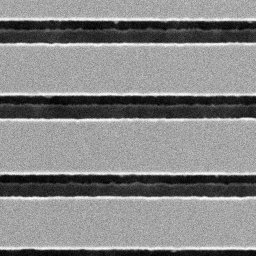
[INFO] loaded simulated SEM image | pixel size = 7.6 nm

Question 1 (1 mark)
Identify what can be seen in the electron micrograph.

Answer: lines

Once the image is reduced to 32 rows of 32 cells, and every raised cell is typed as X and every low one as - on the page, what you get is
XXXXXXXXXXXXXXXXXXXXXXXXXXXXXXXX
XXXXXXXXXXXXXXXXXXXXXXXXXXXXXXXX
XXXXXXXXXXXXXXXXXXXXXXXXXXXXXXXX
--------------------------------
--------------------------------
XXXXXXXXXXXXXXXXXXXXXXXXXXXXXXXX
XXXXXXXXXXXXXXXXXXXXXXXXXXXXXXXX
XXXXXXXXXXXXXXXXXXXXXXXXXXXXXXXX
XXXXXXXXXXXXXXXXXXXXXXXXXXXXXXXX
XXXXXXXXXXXXXXXXXXXXXXXXXXXXXXXX
XXXXXXXXXXXXXXXXXXXXXXXXXXXXXXXX
XXXXXXXXXXXXXXXXXXXXXXXXXXXXXXXX
--------------------------------
--------------------------------
--------------------------------
XXXXXXXXXXXXXXXXXXXXXXXXXXXXXXXX
XXXXXXXXXXXXXXXXXXXXXXXXXXXXXXXX
XXXXXXXXXXXXXXXXXXXXXXXXXXXXXXXX
XXXXXXXXXXXXXXXXXXXXXXXXXXXXXXXX
XXXXXXXXXXXXXXXXXXXXXXXXXXXXXXXX
XXXXXXXXXXXXXXXXXXXXXXXXXXXXXXXX
XXXXXXXXXXXXXXXXXXXXXXXXXXXXXXXX
--------------------------------
--------------------------------
--------------------------------
XXXXXXXXXXXXXXXXXXXXXXXXXXXXXXXX
XXXXXXXXXXXXXXXXXXXXXXXXXXXXXXXX
XXXXXXXXXXXXXXXXXXXXXXXXXXXXXXXX
XXXXXXXXXXXXXXXXXXXXXXXXXXXXXXXX
XXXXXXXXXXXXXXXXXXXXXXXXXXXXXXXX
XXXXXXXXXXXXXXXXXXXXXXXXXXXXXXXX
--------------------------------